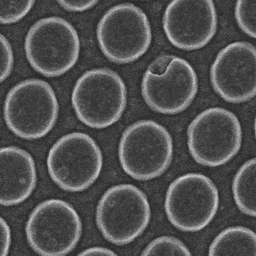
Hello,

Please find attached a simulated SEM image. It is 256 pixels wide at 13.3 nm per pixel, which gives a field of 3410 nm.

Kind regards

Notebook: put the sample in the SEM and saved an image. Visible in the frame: a regular array of raised bodies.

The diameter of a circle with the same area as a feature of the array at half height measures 702 nm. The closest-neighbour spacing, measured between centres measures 899 nm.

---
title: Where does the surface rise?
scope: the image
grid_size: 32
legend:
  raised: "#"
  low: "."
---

####....###..........#####....##
###...........###....######...##
##....#......#####...######...##
....#####...#######..######...##
....#####...#######..#####......
#..#######...#####....###.......
#..#######...#####..........####
#...#####......#......#....#####
#....###............####...#####
#..........###....######...#####
...##.....#####...######...#####
..####...######...######...#####
.######..######...######.....#..
.######..######....####.........
.######...#####..........####...
.#####.....###...##.....######..
..####..........#####...######..
........###....######...######..
.......#####...######...######..
###...######...######...#####...
####..#######..######.....#....#
####..######....####..........##
####...#####..........####...###
####....##....###....######..###
###..........#####...######..###
......##.....#####...######...##
....#####...#######..######....#
....######..######...#####......
#..#######...#####.....##.......
#...######...####...........####
#...#####..........####....#####
#....###...###....#####...######